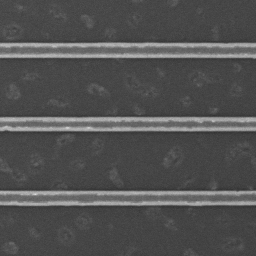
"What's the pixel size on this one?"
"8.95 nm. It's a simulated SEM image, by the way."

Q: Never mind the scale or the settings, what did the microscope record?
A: one or a few lines or trenches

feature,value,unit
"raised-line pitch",663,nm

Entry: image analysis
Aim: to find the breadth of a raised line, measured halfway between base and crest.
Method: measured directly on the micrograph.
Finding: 0.0985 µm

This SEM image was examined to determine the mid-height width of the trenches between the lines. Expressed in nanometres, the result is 564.